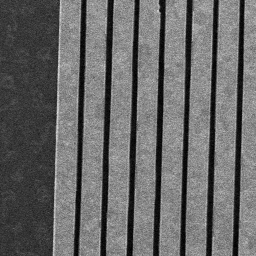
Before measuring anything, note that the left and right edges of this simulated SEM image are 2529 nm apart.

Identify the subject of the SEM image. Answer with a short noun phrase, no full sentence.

parallel lines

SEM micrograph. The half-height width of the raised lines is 198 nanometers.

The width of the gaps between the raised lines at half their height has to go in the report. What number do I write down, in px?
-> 6.38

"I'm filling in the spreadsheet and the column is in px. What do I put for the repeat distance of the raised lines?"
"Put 26.4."